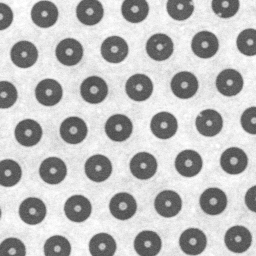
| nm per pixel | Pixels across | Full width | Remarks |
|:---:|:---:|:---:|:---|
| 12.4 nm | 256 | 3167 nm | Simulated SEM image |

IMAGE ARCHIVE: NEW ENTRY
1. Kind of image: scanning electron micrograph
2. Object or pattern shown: an array of small figures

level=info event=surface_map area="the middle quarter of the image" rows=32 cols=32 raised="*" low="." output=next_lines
...*****************************
*****************************..*
*****************...********....
*****.....******......*****.....
****.......****.......****......
****.......****...*....***....*.
****...*...****........***......
****.......****.......*****.....
****.......*****......******....
*****.....*******...************
********************************
********************************
************...*******......****
....*******.....******......****
.....*****.......****........***
......****...*....***....*...***
..*...****.......****.......****
......****.......*****......****
......*****......******....*****
.....********..*****************
********************************
*****************************...
*******...*******.....******....
******.....******......*****....
*****.......****........***....*
.****.......****...*....***.....
.****.......****.......*****....
.****.......*****......*****....
.*****.....*******....********..
*******...**********************
********************************
*************************...****